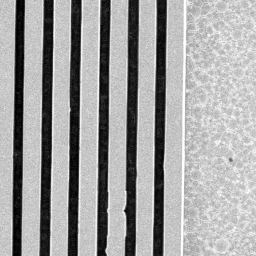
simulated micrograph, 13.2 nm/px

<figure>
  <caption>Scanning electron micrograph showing parallel lines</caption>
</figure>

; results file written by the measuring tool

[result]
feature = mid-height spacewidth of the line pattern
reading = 137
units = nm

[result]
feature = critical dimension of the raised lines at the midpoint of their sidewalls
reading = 0.241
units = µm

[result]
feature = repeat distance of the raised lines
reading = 376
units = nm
